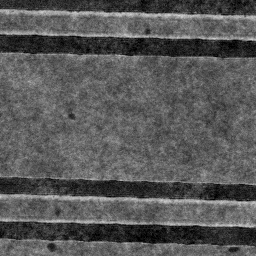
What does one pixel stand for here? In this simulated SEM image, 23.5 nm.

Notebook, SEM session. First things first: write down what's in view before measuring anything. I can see lines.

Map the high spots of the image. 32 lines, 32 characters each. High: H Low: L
LLLLLLLLLLLLLLLLLLLLLLLLLLLLLLLL
HHHLLLLLLLLLLLLLLLLLLLLLLLLLLLLL
HHHHHHHHHHHHHHHHHHHHHHHHHHHHHHHH
HHHHHHHHHHHHHHHHHHHHHHHHHHHHHHHH
LLLLLLLLLLLLLLLLHHHHHHHHHHHHHHHH
LLLLLLLLLLLLLLLLLLLLLLLLLLLLLLLL
LLLLLLLLLLLLLLLLLLLLLLLLLLLLLLLL
HHHHHHHHHHHHHHHHHHHHHHHHHHHHHHHH
HHHHHHHHHHHHHHHHHHHHHHHHHHHHHHHH
HHHHHHHHHHHHHHHHHHHHHHHHHHHHHHHH
HHHHHHHHHHHHHHHHHHHHHHHHHHHHHHHH
HHHHHHHHHHHHHHHHHHHHHHHHHHHHHHHH
HHHHHHHHHHHHHHHHHHHHHHHHHHHHHHHH
HHHHHHHHHHHHHHHHHHHHHHHHHHHHHHHH
HHHHHHHHHHHHHHHHHHHHHHHHHHHHHHHH
HHHHHHHHHHHHHHHHHHHHHHHHHHHHHHHH
HHHHHHHHHHHHHHHHHHHHHHHHHHHHHHHH
HHHHHHHHHHHHHHHHHHHHHHHHHHHHHHHH
HHHHHHHHHHHHHHHHHHHHHHHHHHHHHHHH
HHHHHHHHHHHHHHHHHHHHHHHHHHHHHHHH
HHHHHHHHHHHHHHHHHHHHHHHHHHHHHHHH
HHHHHHHHHHHHHHHHHHHHHHHHHHHHHHHH
LLLLLLLLLLLLLLLHHHHHHHHHHHHHHHHH
LLLLLLLLLLLLLLLLLLLLLLLLLLLLLLLL
HLLLLLLLLLLLLLLLLLLLLLLLLLLLLLLL
HHHHHHHHHHHHHHHHHHHHHHHHHHHHHHHH
HHHHHHHHHHHHHHHHHHHHHHHHHHHHHHHH
HHHHHHHHHHHHHHHHHHHHHHHHHHHHHHHH
LLLLLLLLLLLLLLLLLLLLLLLLLLLLLLLL
LLLLLLLLLLLLLLLLLLLLLLLLLLLLLLLL
HHHHHHHHHHHHHHHHHHHLLLLLLLLLLLLL
HHHHHHHHHHHHHHHHHHHHHHHHHHHHHHHH